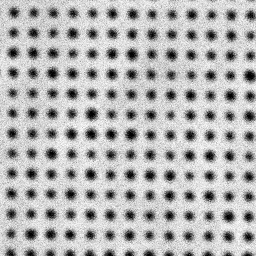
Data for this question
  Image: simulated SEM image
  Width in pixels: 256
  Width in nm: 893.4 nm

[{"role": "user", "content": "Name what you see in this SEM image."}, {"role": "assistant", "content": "a regular array of holes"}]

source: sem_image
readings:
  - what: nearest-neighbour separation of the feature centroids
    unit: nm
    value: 68.6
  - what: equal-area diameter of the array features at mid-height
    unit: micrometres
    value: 0.0339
